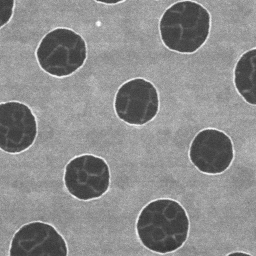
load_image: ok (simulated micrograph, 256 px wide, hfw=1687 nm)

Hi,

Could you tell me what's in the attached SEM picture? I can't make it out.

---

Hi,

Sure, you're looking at holes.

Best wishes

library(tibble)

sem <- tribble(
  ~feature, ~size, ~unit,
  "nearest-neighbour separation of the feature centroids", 590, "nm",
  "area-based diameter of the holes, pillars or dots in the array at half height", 0.305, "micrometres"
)